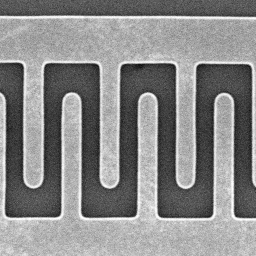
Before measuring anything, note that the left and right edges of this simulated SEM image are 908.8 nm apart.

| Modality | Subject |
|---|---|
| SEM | groups of lines, slits or small figures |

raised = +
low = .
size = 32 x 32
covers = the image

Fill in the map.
................................
................................
++++++++++++++++++++++++++++++++
++++++++++++++++++++++++++++++++
++++++++++++++++++++++++++++++++
++++++++++++++++++++++++++++++++
++++++++++++++++++++++++++++++++
++++++++++++++++++++++++++++++++
...++........++.......++........
...++........++.......++........
...++........++.......++........
...++........++.......++........
+..++...++...++..+++..++...++...
+..++...++...++..+++..++...++...
+..++...++...++..+++..++...++...
+..++...++...++..+++..++...++...
+..++...++...++..+++..++...++...
+..++...++...++..+++..++...++...
+..++...++...++..+++..++...++...
+..++...++...++..+++..++...++...
...++...++...++..+++..++...++...
...++...++...++..+++..++...++...
...++...++...++..+++..++...++...
........++.......+++.......++...
........++.......+++.......++...
........++.......+++.......++...
........++.......+++.......++...
++++++++++++++++++++++++++++++++
++++++++++++++++++++++++++++++++
++++++++++++++++++++++++++++++++
++++++++++++++++++++++++++++++++
++++++++++++++++++++++++++++++++